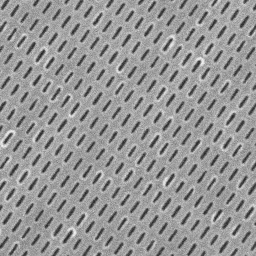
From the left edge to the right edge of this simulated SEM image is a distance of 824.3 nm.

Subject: a regular array of holes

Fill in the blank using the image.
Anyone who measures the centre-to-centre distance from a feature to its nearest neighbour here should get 38.1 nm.